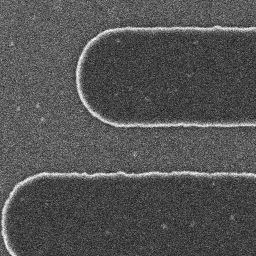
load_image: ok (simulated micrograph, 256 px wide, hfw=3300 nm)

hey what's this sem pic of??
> one or a few lines or trenches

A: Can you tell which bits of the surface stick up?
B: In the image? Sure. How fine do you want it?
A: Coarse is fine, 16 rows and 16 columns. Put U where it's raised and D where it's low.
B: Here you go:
DDDDDDDDDDDDDDDD
DDDDDDDDDDDDDDDD
DDDDDDUUUUUUUUUU
DDDDDUUUUUUUUUUU
DDDDDUUUUUUUUUUU
DDDDDUUUUUUUUUUU
DDDDDUUUUUUUUUUU
DDDDDDUUUUUUUUUU
DDDDDDDDDDDDDDDD
DDDDDDDDDDDDDDDD
DDDDDDDDDDDDDDDD
DUUUUUUUUUUUUUUU
UUUUUUUUUUUUUUUU
UUUUUUUUUUUUUUUU
UUUUUUUUUUUUUUUU
DUUUUUUUUUUUUUUU